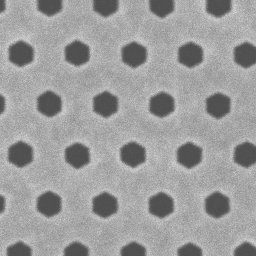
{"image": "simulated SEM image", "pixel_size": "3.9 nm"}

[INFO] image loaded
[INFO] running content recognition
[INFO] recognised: a regular array of holes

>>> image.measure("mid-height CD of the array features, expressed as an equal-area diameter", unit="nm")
102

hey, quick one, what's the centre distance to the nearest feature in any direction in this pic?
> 219 nm